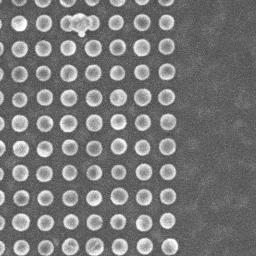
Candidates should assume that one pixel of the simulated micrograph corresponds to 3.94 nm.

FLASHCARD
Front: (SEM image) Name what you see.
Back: a regular array of raised bodies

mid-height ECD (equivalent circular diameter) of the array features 15.6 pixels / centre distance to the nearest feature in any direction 94.5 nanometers